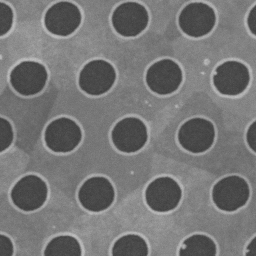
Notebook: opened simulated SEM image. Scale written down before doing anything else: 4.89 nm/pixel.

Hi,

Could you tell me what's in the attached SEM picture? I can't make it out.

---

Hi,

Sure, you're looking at a regular array of holes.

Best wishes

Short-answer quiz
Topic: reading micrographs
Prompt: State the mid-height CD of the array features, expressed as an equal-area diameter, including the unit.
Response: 38.4 px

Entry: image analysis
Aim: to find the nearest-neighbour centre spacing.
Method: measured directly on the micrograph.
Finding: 66.6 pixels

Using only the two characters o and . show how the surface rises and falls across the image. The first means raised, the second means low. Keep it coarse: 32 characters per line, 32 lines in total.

.oooooo..oooooo...ooooo...oooooo
..oooo....oooo.....ooo.....oooo.
..ooo.....oooo.....ooo.....oooo.
..oooo....oooo....oooo.....oooo.
.oooooo..oooooo..oooooo...oooooo
oooooooooooooooooooooooooooooooo
oooooooooooooooooooooooooooooooo
ooo.ooooooo..ooooooo..oooooo..oo
oo....oooo....oooo.....oooo....o
o.....oooo.....ooo.....oooo....o
o.....oooo....oooo.....oooo....o
oo...ooooo...oooooo...ooooo....o
oooooooooooooooooooooooooooooooo
oooooooooooooooooooooooooooooooo
oooooooooooooooo.ooooooooooooooo
.ooooo....oooo....ooooo....oooo.
..ooo.....oooo.....ooo.....oooo.
..ooo.....oooo.....ooo.....oooo.
.ooooo....oooo....ooooo...ooooo.
oooooooooooooooooooooooooooooooo
oooooooooooooooooooooooooooooooo
oooooooooooooooooooooooooooooooo
oo....ooooo...ooooo...ooooo....o
o.....oooo....oooo.....oooo....o
o.....oooo....oooo.....ooo.....o
oo....oooo....oooo....ooooo....o
ooo.ooooooo..oooooo..ooooooo.ooo
oooooooooooooooooooooooooooooooo
oooooooooooooooooooooooooooooooo
.oooooo..oooooo...oooooo..oooooo
..oooo....oooo.....oooo....oooo.
..ooo.....oooo.....ooo.....oooo.